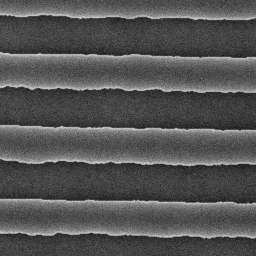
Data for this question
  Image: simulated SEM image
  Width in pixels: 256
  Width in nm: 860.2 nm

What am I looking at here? lines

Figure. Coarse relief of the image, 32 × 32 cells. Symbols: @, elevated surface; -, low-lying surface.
@@@@@@@@@@@@@@@@@@@@@@@@@@@@@@@@
@@@@@@@@@@@@@@@@@@@@@@@@@@@@@@@@
--------------------------------
--------------------------------
--------------------------------
--------------------------------
--------------------------------
@@@@@@@@@@@@@@@@@@@@@@@@@@@@@@@@
@@@@@@@@@@@@@@@@@@@@@@@@@@@@@@@@
@@@@@@@@@@@@@@@@@@@@@@@@@@@@@@@@
@@@@@@@@@@@@@@@@@@@@@@@@@@@@@@@@
-------------------------@-@@@@@
--------------------------------
--------------------------------
--------------------------------
--------------------------------
@@@@@@@@@@@@@@@@@@@@@@@@@@@@@@@@
@@@@@@@@@@@@@@@@@@@@@@@@@@@@@@@@
@@@@@@@@@@@@@@@@@@@@@@@@@@@@@@@@
@@@@@@@@@@@@@@@@@@@@@@@@@@@@@@@@
-----------------@@@@@@@@@@@@@-@
--------------------------------
--------------------------------
--------------------------------
--------------------------------
@@@@@@@@@@@@@@@@@@@@@@@@@@@@@@@@
@@@@@@@@@@@@@@@@@@@@@@@@@@@@@@@@
@@@@@@@@@@@@@@@@@@@@@@@@@@@@@@@@
@@@@@@@@@@@@@@@@@@@@@@@@@@@@@@@@
-------------------@@@---@@@@@@@
--------------------------------
--------------------------------